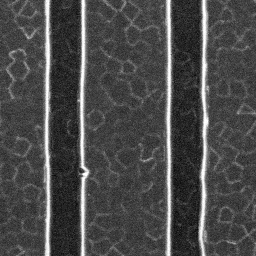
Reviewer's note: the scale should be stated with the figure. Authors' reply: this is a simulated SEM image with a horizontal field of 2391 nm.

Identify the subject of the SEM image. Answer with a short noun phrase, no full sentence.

one or a few lines or trenches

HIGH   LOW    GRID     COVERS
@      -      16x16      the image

@@@--@@@@@@--@@@
@@@--@@@@@@--@@@
@@@--@@@@@@--@@@
@@@--@@@@@@--@@@
@@@--@@@@@@--@@@
@@@--@@@@@@--@@@
@@@--@@@@@@--@@@
@@@--@@@@@@--@@@
@@@--@@@@@@--@@@
@@@--@@@@@@--@@@
@@@--@@@@@@--@@@
@@@--@@@@@@--@@@
@@@--@@@@@@--@@@
@@@--@@@@@@--@@@
@@@--@@@@@@--@@@
@@@--@@@@@---@@@